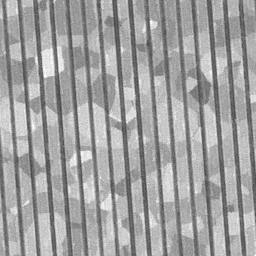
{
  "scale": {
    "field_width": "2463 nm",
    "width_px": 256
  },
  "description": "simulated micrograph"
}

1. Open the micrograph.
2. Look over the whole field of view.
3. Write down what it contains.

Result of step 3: parallel lines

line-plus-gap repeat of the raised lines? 152 nanometres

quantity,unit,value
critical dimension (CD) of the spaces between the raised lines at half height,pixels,4.86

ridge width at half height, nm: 103